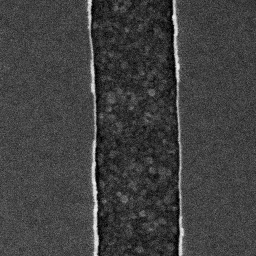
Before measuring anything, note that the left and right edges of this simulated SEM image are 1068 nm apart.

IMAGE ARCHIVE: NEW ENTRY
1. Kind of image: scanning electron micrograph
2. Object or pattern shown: one or a few lines or trenches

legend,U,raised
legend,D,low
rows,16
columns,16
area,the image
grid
UUUUUUDDDDDUUUUU
UUUUUUDDDDDUUUUU
UUUUUUDDDDDUUUUU
UUUUUUDDDDDUUUUU
UUUUUUDDDDDUUUUU
UUUUUUDDDDDUUUUU
UUUUUUDDDDDUUUUU
UUUUUUDDDDDUUUUU
UUUUUUDDDDDUUUUU
UUUUUUDDDDDUUUUU
UUUUUUDDDDDUUUUU
UUUUUUDDDDDUUUUU
UUUUUUDDDDDUUUUU
UUUUUUDDDDDUUUUU
UUUUUUDDDDDUUUUU
UUUUUUDDDDDUUUUU